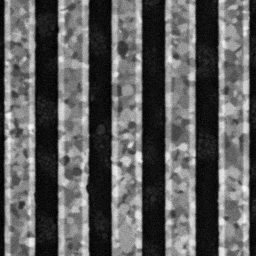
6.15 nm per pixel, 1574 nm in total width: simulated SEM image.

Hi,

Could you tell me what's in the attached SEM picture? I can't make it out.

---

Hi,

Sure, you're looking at parallel lines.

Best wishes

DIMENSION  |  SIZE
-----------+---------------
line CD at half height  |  25 px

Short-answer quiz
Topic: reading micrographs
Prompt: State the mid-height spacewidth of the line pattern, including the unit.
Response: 28.5 px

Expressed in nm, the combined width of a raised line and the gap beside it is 329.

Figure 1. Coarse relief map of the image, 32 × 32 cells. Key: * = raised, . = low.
.***....***...***....***....***.
.***....***...***....***....***.
.***....***...***....***....***.
.***....***...***....***....***.
.***....***...***....***....***.
.***....***...***....***....***.
.***....***...***....***....***.
.***....***...***....***....***.
.***....***...***....***....***.
.***....***...***....***....***.
.***....***...***....***....***.
.***....***...***....***....***.
.***....***...***....***....***.
.***....***...***....***....***.
.***....***...***....***....***.
.***....***...***....***....***.
.***....***...***....***....***.
.***....***...***....***....***.
.***....***...***....***....***.
.***....***...***....***....***.
.***....***...***....***....***.
.***....***...***....***....***.
.***....***...***....***....***.
.***....**....***....***....***.
.***....***...***....***....***.
.***....***...***....***....***.
.***....***...***....***....***.
.***....***...***....***....***.
.***....***...***....***....***.
.***....***...***....***....***.
.***....***...***....***....***.
.***....***...***....***....***.